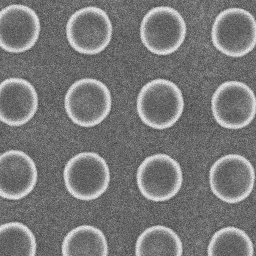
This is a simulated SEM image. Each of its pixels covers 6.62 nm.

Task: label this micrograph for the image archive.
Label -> raised bodies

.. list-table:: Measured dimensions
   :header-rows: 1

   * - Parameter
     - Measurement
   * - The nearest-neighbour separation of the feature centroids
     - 479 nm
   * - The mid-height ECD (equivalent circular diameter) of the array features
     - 293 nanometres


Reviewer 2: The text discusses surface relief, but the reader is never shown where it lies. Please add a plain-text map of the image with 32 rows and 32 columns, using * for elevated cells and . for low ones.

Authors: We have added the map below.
................................
****......***......***......***.
*****....*****....*****....*****
*****....*****....*****....*****
*****....*****....*****....*****
****.....****.....****.....*****
..........**.......**.......***.
................................
................................
................................
***.......***......**.......**..
****.....****.....****.....****.
****....******...******....*****
****....******...******....*****
****.....****.....****.....*****
.*........**.......**.......***.
................................
................................
................................
***.......**................*...
****.....****.....****.....****.
****....*****....*****....******
****....*****....******...******
****.....****.....****.....****.
.**.......**......***......****.
................................
................................
................................
***.......*........*............
****.....****.....****.....****.
****....*****....*****....*****.
****....*****....*****....*****.